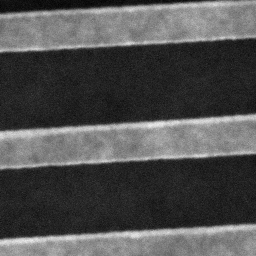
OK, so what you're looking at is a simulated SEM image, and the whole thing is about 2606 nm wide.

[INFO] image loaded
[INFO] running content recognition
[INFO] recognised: lines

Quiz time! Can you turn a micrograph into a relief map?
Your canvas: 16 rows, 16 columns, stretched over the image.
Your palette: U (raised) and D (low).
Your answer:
DDDDDDUUUUUUUUUU
UUUUUUUUUUUUUUUU
UUUUUUUUUUUUUUDD
DDDDDDDDDDDDDDDD
DDDDDDDDDDDDDDDD
DDDDDDDDDDDDDDDD
DDDDDDDDDDDDDDDD
DDDDDDDDDDDUUUUU
UUUUUUUUUUUUUUUU
UUUUUUUUUUUUUUUU
DDDDDDDDDDDDDDDD
DDDDDDDDDDDDDDDD
DDDDDDDDDDDDDDDD
DDDDDDDDDDDDDDDD
DDDDDDDDUUUUUUUU
UUUUUUUUUUUUUUUU